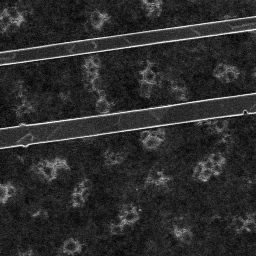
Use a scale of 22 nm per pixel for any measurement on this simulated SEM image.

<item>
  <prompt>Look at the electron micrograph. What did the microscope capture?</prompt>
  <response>one or a few lines or trenches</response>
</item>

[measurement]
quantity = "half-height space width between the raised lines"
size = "1400 nanometers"